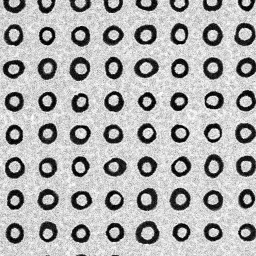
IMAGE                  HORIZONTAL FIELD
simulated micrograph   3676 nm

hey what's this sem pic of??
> a regular array of ring-shaped grooves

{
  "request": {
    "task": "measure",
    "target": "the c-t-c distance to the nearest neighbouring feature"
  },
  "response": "0.459 µm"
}